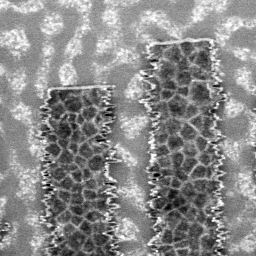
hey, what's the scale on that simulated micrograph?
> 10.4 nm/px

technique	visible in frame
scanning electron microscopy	one or a few lines or trenches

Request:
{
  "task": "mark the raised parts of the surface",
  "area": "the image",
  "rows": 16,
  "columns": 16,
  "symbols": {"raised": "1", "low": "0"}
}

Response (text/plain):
0000000000000000
0000000000000000
0000000000000000
0000000001111000
0000000001111000
0000000001111100
0001111001111100
0001111000111000
0001110000111100
0001111001111100
0001111001111100
0001111000111100
0001111000111100
0001111000111100
0001111000111100
0001111000111100